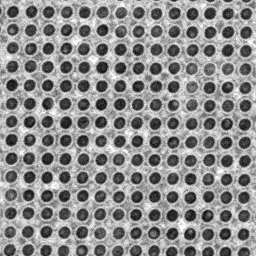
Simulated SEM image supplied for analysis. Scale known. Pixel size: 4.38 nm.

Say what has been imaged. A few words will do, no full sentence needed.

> a regular array of holes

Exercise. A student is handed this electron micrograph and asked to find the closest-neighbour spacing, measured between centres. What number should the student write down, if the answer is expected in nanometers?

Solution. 76.7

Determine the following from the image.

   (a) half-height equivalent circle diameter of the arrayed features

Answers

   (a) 58.6 nm